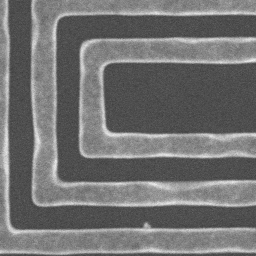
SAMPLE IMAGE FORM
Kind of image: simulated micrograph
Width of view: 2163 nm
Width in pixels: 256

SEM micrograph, groups of lines, slits or small figures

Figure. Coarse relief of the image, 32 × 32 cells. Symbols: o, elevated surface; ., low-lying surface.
o...oooooooooooooooooooooooooooo
o...oooooooooooooooooooooooooooo
o...ooo.........................
o...ooo.........................
o...ooo.........................
o...ooo....ooooooooooooooooooooo
o...ooo...oooooooooooooooooooooo
o...ooo...oooooooooooooooooooooo
o...ooo...ooo...................
o...ooo...ooo...................
o...ooo...ooo...................
o...ooo...ooo...................
o...ooo...ooo...................
o...ooo...ooo...................
o...ooo...ooo...................
o...ooo...ooo...................
o...ooo...oooo..................
o....oo...oooooooooooooooooooooo
o...ooo...oooooooooooooooooooooo
o...ooo....oooooooo..ooooooo...o
o...ooo.........................
o...ooo.........................
o...ooo.........................
o...oooooooooooooooooooooooooooo
o...oooooooooooooooooooooooooooo
o...ooooo.ooooooooooo....ooooooo
o...............................
o...............................
o...............................
oooooooooooooooooooooooooooooooo
oooooooooooooooooooooooooooooooo
ooooooooooooooooo...oooooo......